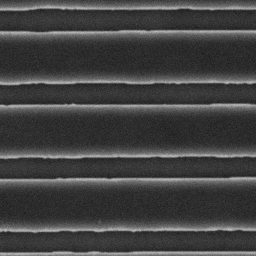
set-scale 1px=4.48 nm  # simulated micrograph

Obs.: lines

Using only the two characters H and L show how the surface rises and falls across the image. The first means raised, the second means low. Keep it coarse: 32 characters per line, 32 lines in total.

HHHHHHHHHHHHHHHHHHHHHHHHHHHHHHHH
LLLLLLLLLLLLLLLLLLLLLLLLLLLLLLLL
LLLLLLLLLLLLLLLLLLLLLLLLLLLLLLLL
LLLLLLLLLLLLLLLLLLLLLLLLLLLLLLLL
HHHHHHHHHHHHHHHHHHHHHHHHHHHHHHHH
HHHHHHHHHHHHHHHHHHHHHHHHHHHHHHHH
HHHHHHHHHHHHHHHHHHHHHHHHHHHHHHHH
HHHHHHHHHHHHHHHHHHHHHHHHHHHHHHHH
HHHHHHHHHHHHHHHHHHHHHHHHHHHHHHHH
HHHHHHHHHHHHHHHHHHHHHHHHHHHHHHHH
HHHLLLLLLLLLLLLLLLLLLLLLLLLLLLLL
LLLLLLLLLLLLLLLLLLLLLLLLLLLLLLLL
LLLLLLLLLLLLLLLLLLLLLLLLLLLLLLLL
HHHHHHHHHHHHHHHHHHHHHHHHHHHHHHHH
HHHHHHHHHHHHHHHHHHHHHHHHHHHHHHHH
HHHHHHHHHHHHHHHHHHHHHHHHHHHHHHHH
HHHHHHHHHHHHHHHHHHHHHHHHHHHHHHHH
HHHHHHHHHHHHHHHHHHHHHHHHHHHHHHHH
HHHHHHHHHHHHHHHHHHHHHHHHHHHHHHHH
HHHHHHHHHHHHHHHHHHHLHHHLLLLHHHLL
LLLLLLLLLLLLLLLLLLLLLLLLLLLLLLLL
LLLLLLLLLLLLLLLLLLLLLLLLLLLLLLLL
HHHHHHHHHHHHHHHHHHHHHHHHHHHHHHHH
HHHHHHHHHHHHHHHHHHHHHHHHHHHHHHHH
HHHHHHHHHHHHHHHHHHHHHHHHHHHHHHHH
HHHHHHHHHHHHHHHHHHHHHHHHHHHHHHHH
HHHHHHHHHHHHHHHHHHHHHHHHHHHHHHHH
HHHHHHHHHHHHHHHHHHHHHHHHHHHHHHHH
HHHHHHHHHHHHHHHHHHHHHHHHHHHHHHHH
LLLLLLLLLLLLLLLLLLLLLLLLLLLLLLLL
LLLLLLLLLLLLLLLLLLLLLLLLLLLLLLLL
LLLLLLLLLLLLLLLLLLLLLLLLLLLLLLLL